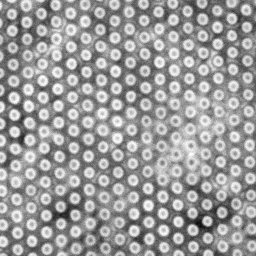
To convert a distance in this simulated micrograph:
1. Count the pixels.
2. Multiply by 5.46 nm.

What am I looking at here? a regular array of raised bodies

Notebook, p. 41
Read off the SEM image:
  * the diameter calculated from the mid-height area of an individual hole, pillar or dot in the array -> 0.0527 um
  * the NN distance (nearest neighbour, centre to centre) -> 0.0906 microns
